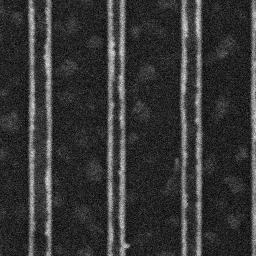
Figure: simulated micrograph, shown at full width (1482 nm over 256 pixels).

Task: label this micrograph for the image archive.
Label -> one or a few lines or trenches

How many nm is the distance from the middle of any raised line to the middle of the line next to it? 437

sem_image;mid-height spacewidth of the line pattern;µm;0.344